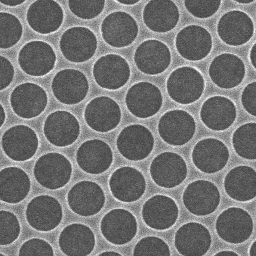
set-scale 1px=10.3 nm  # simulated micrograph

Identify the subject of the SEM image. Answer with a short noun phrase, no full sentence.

a regular array of holes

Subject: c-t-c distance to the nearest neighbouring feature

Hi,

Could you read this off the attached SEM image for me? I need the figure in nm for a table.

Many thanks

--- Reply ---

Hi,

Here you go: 442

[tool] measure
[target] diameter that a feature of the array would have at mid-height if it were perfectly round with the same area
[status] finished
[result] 0.375 microns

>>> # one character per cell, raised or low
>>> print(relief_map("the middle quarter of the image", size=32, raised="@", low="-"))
@@@@@@@---------@@--------@@@@@@
---@@@@---------@@@------@@@----
-----@@----------@@@@--@@@@-----
------@@--------@@@@@@@@@@------
------@@--------@@@@-@@@@@------
------@@@------@@------@@@------
------@@@@@@@@@@--------@@------
------@@@@@@@@@@--------@@------
-----@@@----@@@----------@@-----
----@@-------@@----------@@@----
@@@@@@--------@@--------@@@@@@@@
@@@@@---------@@--------@@@---@@
--@@@---------@@@------@@------@
---@@---------@@@@@--@@@--------
----@@--------@@@@@@@@@@--------
----@@-------@@@----@@@---------
----@@@@----@@@------@@---------
----@@@@@@@@@@--------@@--------
---@@@@@@@@@@---------@@--------
--@@@-----@@@----------@@------@
@@@@-------@@---------@@@@@@@@@@
@@@---------@@--------@@@@@@@@@@
@@@---------@@-------@@@----@@@@
-@@---------@@@-----@@@-------@@
-@@---------@@@@@@@@@@--------@@
--@@-------@@@@@@@@@@@---------@
--@@@------@@------@@----------@
--@@@@@--@@@-------@@@---------@
--@@@@@@@@@@--------@@--------@@
-@@@---@@@@---------@@@------@@@
@@-------@@---------@@@@----@@@-
@---------@@--------@@@@@@@@@@--